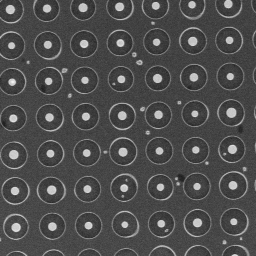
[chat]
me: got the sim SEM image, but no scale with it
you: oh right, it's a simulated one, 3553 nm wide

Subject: an array of small figures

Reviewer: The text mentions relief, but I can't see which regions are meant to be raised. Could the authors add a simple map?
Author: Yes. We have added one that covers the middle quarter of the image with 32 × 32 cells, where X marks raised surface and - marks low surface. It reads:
XXXXXXXXXXXXXXXXXXXXXXX-XXXXXXX-
XXX----XXXXX----XXXXX-----XXXX--
XX------XXX------XXXX-----XXX---
XX---X--XXX---X--XXX--XX---XX---
XX---X--XXX---X--XXXX--X--XXX---
XX------XXXX-----XXXX-----XXXX--
XXX----XXXXXX---XXXXXXX-XXXXXXXX
XXXXXXXXXXXXXXXXXXXXXXXXXXXXXXXX
XXXXXXXXXXXXXXXXXXXXXXXXXXXXXXXX
XXXXXXXXXXXXXXXXXXXXXXXXXXXXXXXX
XXXX---XXXXX-----XXXX-----XXXX--
XXX-----XXXX-----XXXX------XXX--
XX---X---XX---X---XX---X---XX---
XX---X---XX---X---XX---X---XXX--
XX------XXXX-----XXXX-----XXXX--
XXX-----XXXX-----XXXXX---XXXXXXX
XXXXXXXXXXXXXXXXXXXXXXXXXXXXXXXX
XXXXXXXXXXXXXXXXXXXXXXXXXXXXXXXX
XXXXXXXXXXXXXX-XXXXXXXX--XXXXXXX
XXXX----XXXX-----XXXX-----XXXX--
XXX------XXX------XXX------XXX--
XX---X---XX---XX--XX---XX--XXX--
XX---X---XX---XX--XXX------XXX--
XXX------XXX------XXX------XXX--
XXX-----XXXXX----XXXXX----XXXXX-
XXXXX-XXXXXXXXXXXXXXXXXXXXXXXXXX
XXXXXXXXXXXXXXXXXXXXXXXXXXXXXXXX
XXXXXXXXXXXXXXX-XXXXXXXXXXXXXXXX
XXXX----XXXXX----XXXXX----XXXXX-
XXX------XXX------XXX------XXX--
XXX------XXX------XXX--XX--XXX--
XXX--XX--XXX--XX--XXX------XXX--